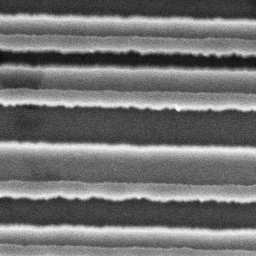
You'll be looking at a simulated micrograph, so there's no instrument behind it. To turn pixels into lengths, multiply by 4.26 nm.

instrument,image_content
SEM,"lines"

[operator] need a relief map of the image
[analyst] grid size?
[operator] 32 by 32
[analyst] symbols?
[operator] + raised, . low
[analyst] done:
................................
................................
+++++++++++++++.++...++.........
++++++++++++++++++++++++++++++++
++++++++++++++++++++++++++++++++
++++++++++++++++++++++++++++++++
.....................+.+++++++++
................................
+++.............................
++++++++++++++++++++++++++++++++
++++++++++++++++++++++++++++++++
++++++++++++++++++++++++++++++++
++++++++++++++++++++++++++++++++
...................+..+.++.+..++
................................
................................
................................
................................
++++++++++++++++................
++++++++++++++++++++++++++++++++
++++++++++++++++++++++++++++++++
++++++++++++++++++++++++++++++++
++++++++++++++++++++++++++++++++
++++++++++++++++++++++++++++++++
....++..+++..+++++++++++++++++++
................................
................................
................................
.+++...++.......................
++++++++++++++++++++++++++++++++
++++++++++++++++++++++++++++++++
++++++++++++++++++++++++++++++++